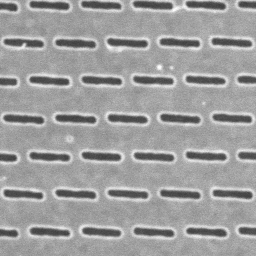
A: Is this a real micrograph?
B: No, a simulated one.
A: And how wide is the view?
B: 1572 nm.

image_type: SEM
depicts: a regular array of holes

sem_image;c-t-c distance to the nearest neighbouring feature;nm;280